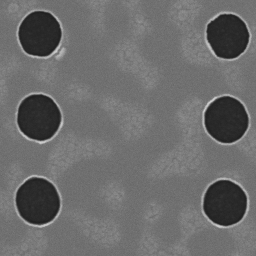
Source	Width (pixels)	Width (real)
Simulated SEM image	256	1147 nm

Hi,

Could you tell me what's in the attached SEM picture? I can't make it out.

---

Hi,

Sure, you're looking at holes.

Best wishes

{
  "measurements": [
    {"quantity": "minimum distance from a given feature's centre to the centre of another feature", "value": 0.374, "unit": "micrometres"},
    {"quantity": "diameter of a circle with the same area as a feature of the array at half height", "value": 200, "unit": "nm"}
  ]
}